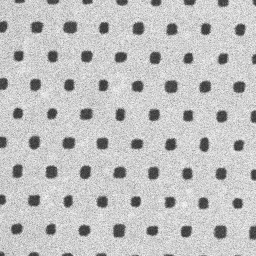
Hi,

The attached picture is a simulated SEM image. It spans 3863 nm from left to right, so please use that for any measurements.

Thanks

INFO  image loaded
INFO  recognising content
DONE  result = a regular array of holes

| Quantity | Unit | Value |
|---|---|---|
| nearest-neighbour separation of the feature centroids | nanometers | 500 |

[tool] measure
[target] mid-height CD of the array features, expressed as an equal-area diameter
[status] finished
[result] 12.4 pixels